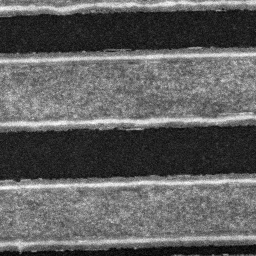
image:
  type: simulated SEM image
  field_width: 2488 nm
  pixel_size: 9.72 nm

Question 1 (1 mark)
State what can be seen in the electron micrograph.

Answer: one or a few lines or trenches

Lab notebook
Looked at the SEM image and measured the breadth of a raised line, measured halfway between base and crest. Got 592 nanometers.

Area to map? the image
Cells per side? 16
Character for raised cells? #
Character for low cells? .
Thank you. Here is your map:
#..##...........
................
................
...........#####
################
################
################
#############...
................
................
................
........########
################
################
################
................